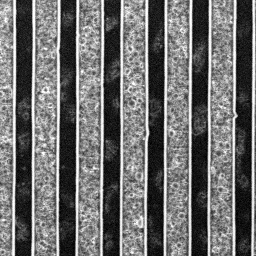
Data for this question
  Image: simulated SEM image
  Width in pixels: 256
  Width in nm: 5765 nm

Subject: parallel lines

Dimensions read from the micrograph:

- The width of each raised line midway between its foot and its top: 574 nm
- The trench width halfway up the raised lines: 419 nm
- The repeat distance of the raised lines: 0.991 um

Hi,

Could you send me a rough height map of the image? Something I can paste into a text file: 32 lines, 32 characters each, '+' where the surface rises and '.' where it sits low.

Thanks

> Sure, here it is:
++..+++...+++..+++...+++..+++...
++..+++...+++..+++...+++..+++...
++..+++...+++..+++...+++..+++...
++..+++...+++..+++...+++..+++...
++..+++...+++..+++...+++..+++...
++..+++...+++..+++...+++..+++...
++..+++...+++..+++...+++..+++...
++..+++...+++..+++...+++..+++...
++..+++...+++..+++...+++..+++...
++..+++...+++..+++...+++..+++...
++..+++...+++..+++...+++..+++...
++..+++...+++..+++...+++..+++...
++..+++...+++..+++...+++..+++...
++..+++...+++..+++...+++..+++...
++..+++...+++..+++...+++..+++...
++..+++...+++..+++...+++..+++...
++..+++...+++..+++...+++..+++...
++..+++...+++..+++...+++..+++...
++..+++...+++..+++...+++..+++...
++..+++...+++..+++...+++..+++...
++..+++...+++..+++...+++..+++...
++..+++...+++..+++...+++..+++...
++..+++...+++..+++...+++..+++...
++..+++...+++..+++...+++..+++...
++..+++...+++..+++...+++..+++...
++..+++...+++..+++...+++..+++...
++..+++...+++..+++...+++..+++...
++..+++...+++..+++...+++..+++...
++..+++...+++..+++...+++..+++...
++..+++...+++..+++...+++..+++...
++..+++...+++..+++...+++..+++...
++..+++...+++..+++...+++..+++...